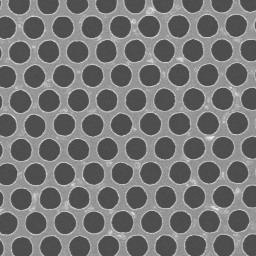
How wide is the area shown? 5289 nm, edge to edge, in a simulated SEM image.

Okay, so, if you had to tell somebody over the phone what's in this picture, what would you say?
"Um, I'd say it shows a regular array of holes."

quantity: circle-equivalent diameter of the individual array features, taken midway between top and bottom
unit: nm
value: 453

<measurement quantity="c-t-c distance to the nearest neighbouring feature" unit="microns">0.581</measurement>